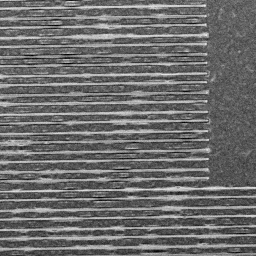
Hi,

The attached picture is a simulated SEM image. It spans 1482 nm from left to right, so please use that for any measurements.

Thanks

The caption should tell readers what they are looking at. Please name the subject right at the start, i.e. parallel lines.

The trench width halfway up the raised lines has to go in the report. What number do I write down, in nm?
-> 42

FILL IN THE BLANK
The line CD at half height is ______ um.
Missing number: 0.0094